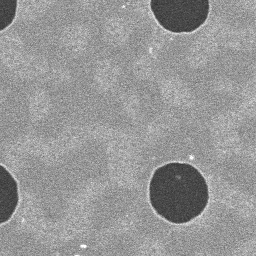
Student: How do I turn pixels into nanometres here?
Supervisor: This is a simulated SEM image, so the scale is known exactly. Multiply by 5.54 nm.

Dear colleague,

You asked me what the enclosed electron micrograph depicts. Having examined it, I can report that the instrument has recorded holes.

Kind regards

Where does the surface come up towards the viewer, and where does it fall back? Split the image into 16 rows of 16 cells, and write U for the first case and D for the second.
DUUUUUUUUDDDDUUU
DUUUUUUUUUDDDUUU
UUUUUUUUUUUUUUUU
UUUUUUUUUUUUUUUU
UUUUUUUUUUUUUUUU
UUUUUUUUUUUUUUUU
UUUUUUUUUUUUUUUU
UUUUUUUUUUUUUUUU
UUUUUUUUUUUUUUUU
UUUUUUUUUUUUUUUU
UUUUUUUUUUDDUUUU
DUUUUUUUUDDDDUUU
DUUUUUUUUDDDDUUU
DUUUUUUUUUDDUUUU
UUUUUUUUUUUUUUUU
UUUUUUUUUUUUUUUU